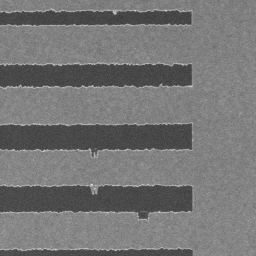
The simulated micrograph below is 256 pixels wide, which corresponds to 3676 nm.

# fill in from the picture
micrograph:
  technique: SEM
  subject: one or a few lines or trenches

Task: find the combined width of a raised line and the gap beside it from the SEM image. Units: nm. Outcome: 892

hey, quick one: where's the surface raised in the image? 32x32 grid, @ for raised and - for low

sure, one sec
@@@@@@@@@@@@@@@@@@@@@@@@@@@@@@@@
-@----------------------@@@@@@@@
------------------------@@@@@@@@
@@@@@@@@@@@@@@@@@@@@@@@@@@@@@@@@
@@@@@@@@@@@@@@@@@@@@@@@@@@@@@@@@
@@@@@@@@@@@@@@@@@@@@@@@@@@@@@@@@
@@@@@@@@@@@@@@@@@@@@@@@@@@@@@@@@
@@@@@@@@@@@@@@@@@@@@@@@@@@@@@@@@
------------------------@@@@@@@@
------------------------@@@@@@@@
------------------------@@@@@@@@
@@@@@@@@@@@@@@@@@@@@@@@@@@@@@@@@
@@@@@@@@@@@@@@@@@@@@@@@@@@@@@@@@
@@@@@@@@@@@@@@@@@@@@@@@@@@@@@@@@
@@@@@@@@@@@@@@@@@@@@@@@@@@@@@@@@
@@@@@@@@@@@@@@@@@@@@----@@@@@@@@
------------------------@@@@@@@@
------------------------@@@@@@@@
------------------------@@@@@@@@
@@@@@@@@@@@@@@@@@@@@@@@@@@@@@@@@
@@@@@@@@@@@@@@@@@@@@@@@@@@@@@@@@
@@@@@@@@@@@@@@@@@@@@@@@@@@@@@@@@
@@@@@@@@@@@@@@@@@@@@@@@@@@@@@@@@
-----------@------------@@@@@@@@
------------------------@@@@@@@@
------------------------@@@@@@@@
--------@--@@@----------@@@@@@@@
@@@@@@@@@@@@@@@@@@@@@@@@@@@@@@@@
@@@@@@@@@@@@@@@@@@@@@@@@@@@@@@@@
@@@@@@@@@@@@@@@@@@@@@@@@@@@@@@@@
@@@@@@@@@@@@@@@@@@@@@@@@@@@@@@@@
------------------------@@@@@@@@